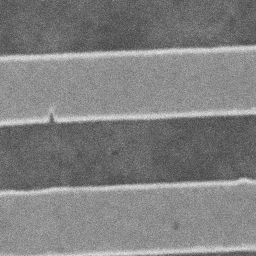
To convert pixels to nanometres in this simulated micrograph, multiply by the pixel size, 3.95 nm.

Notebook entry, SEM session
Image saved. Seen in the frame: one or a few lines or trenches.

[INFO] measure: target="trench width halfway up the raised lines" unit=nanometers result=274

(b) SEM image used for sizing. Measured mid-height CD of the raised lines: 0.256 um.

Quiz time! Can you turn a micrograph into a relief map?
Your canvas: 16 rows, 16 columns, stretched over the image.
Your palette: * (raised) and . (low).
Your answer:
................
................
................
....************
****************
****************
****************
***.............
................
................
................
............****
****************
****************
****************
****************